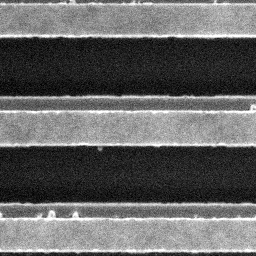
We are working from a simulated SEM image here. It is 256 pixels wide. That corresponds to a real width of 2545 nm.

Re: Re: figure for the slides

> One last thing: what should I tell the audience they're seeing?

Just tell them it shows lines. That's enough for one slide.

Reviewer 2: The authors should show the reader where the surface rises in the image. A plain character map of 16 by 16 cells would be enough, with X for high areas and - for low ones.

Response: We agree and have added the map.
XXXXXXXXXXXXXXXX
XXXXXXXXXXXXXXXX
----------------
----------------
----------------
----------------
XXXXXXXXXXXXXXXX
XXXXXXXXXXXXXXXX
XXXXXXXXXXXXXXXX
----------------
----------------
----------------
----------------
XXXXXXXXXXXXXXXX
XXXXXXXXXXXXXXXX
XXXXXXXXXXXXXXXX